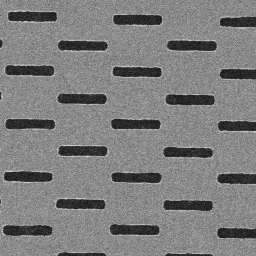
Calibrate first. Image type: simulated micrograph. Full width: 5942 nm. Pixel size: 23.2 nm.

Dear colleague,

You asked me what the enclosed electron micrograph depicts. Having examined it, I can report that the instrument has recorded a regular array of holes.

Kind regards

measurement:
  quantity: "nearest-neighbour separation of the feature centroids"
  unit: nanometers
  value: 1220